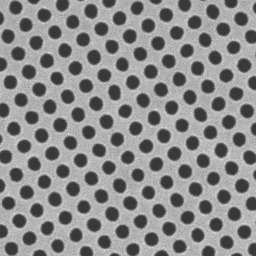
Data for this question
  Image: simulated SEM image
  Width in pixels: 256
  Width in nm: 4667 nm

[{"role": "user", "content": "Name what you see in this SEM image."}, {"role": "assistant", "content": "a regular array of holes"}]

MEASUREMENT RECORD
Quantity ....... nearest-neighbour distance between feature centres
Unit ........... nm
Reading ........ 373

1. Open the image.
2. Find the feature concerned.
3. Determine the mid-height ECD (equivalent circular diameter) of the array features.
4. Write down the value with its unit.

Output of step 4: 264 nanometers